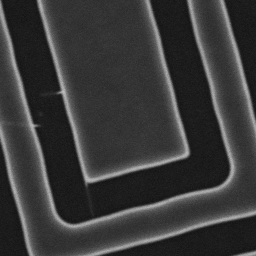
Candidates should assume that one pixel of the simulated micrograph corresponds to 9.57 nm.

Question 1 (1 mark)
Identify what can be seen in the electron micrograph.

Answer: groups of lines, slits or small figures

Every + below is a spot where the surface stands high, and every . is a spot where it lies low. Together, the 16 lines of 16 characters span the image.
...++++++...++..
...+++++++..++..
+..+++++++..+++.
+..+++++++...++.
+...++++++...++.
+...+++++++..++.
++..+++++++..+++
++..+++++++...++
++...+++++++..++
+++..+++++++..++
.++..++++.....++
.++...........++
.++........+++++
.+++...++++++++.
..+++++++++.....
..++++++........